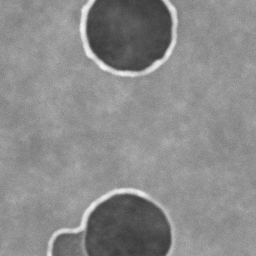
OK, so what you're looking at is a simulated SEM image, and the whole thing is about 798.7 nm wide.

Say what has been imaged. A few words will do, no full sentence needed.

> holes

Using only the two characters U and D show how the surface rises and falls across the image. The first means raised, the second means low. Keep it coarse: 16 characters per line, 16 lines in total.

UUUUUUDDDDUUUUUU
UUUUUDDDDDDUUUUU
UUUUUDDDDDDUUUUU
UUUUUUDDDDUUUUUU
UUUUUUUUUUUUUUUU
UUUUUUUUUUUUUUUU
UUUUUUUUUUUUUUUU
UUUUUUUUUUUUUUUU
UUUUUUUUUUUUUUUU
UUUUUUUUUUUUUUUU
UUUUUUUUUUUUUUUU
UUUUUUUUUUUUUUUU
UUUUUUUDDUUUUUUU
UUUUUUDDDDUUUUUU
UUUUUDDDDDDUUUUU
UUUUUDDDDDDUUUUU